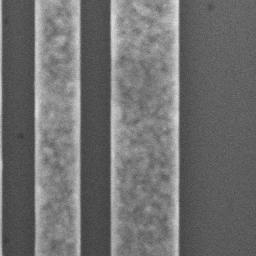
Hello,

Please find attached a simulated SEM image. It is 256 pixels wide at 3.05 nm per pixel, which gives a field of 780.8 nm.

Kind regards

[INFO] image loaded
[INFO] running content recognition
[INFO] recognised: wiring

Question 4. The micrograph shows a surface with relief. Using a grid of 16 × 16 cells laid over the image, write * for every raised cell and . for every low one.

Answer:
..***..****.....
..***..****.....
..***..****.....
..***..****.....
..***..****.....
..***..****.....
..***..****.....
..***..****.....
..***..****.....
..***..****.....
..***..****.....
..***..****.....
..***..****.....
..***..****.....
..***..****.....
..***..****.....